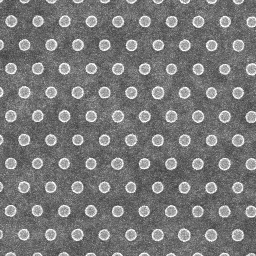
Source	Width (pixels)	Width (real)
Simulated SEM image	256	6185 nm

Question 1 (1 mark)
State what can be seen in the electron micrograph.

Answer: a regular array of raised bodies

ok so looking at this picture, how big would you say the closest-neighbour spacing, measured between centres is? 644 nanometres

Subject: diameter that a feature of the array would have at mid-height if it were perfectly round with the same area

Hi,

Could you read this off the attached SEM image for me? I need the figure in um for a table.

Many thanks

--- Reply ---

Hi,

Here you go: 0.267